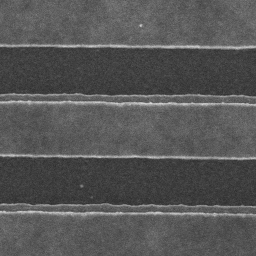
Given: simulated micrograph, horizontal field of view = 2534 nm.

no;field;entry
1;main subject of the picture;lines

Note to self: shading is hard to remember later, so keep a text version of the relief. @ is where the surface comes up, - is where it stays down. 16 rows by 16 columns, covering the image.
@@@@@@@@@@@@@@@@
@@@@@@@@@@@@@@@@
@@@@@@@@@@@@@@@@
----------------
----------------
----------------
@@@@@@@@@@@@@@@@
@@@@@@@@@@@@@@@@
@@@@@@@@@@@@@@@@
@@@@@@@@@@@@@@@@
----------------
----------------
----------------
@@@@@@@@@@@@@@@@
@@@@@@@@@@@@@@@@
@@@@@@@@@@@@@@@@